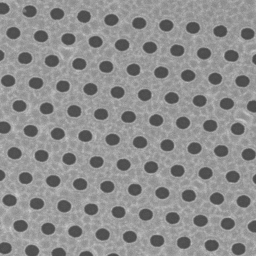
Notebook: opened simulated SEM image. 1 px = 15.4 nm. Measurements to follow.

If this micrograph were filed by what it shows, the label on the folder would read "a regular array of holes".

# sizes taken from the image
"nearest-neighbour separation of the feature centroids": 27.1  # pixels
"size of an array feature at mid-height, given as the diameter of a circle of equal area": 215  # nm